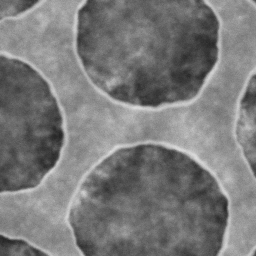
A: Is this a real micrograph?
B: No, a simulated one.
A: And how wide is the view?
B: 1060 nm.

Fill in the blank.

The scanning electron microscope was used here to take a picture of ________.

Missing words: holes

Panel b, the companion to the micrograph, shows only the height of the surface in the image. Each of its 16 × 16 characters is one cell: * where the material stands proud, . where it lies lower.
..***........***
*****.........**
*****.........**
*****.........**
..***........***
...***.......**.
....****...****.
....***********.
....***********.
....***....****.
...***.......***
..***.........**
*****.........**
****..........**
*****.........**
..***.........**